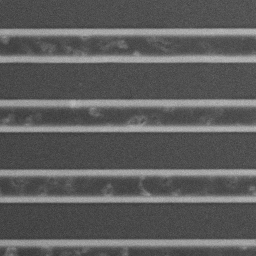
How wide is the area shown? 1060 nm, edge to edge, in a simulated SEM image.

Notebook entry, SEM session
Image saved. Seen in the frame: one or a few lines or trenches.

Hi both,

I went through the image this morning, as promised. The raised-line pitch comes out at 292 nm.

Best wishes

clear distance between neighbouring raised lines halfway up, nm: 174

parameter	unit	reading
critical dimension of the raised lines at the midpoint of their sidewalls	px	28